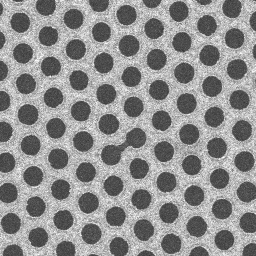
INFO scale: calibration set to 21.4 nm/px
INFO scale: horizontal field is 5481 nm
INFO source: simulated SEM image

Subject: a regular array of holes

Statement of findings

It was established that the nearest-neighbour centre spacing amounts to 650 nm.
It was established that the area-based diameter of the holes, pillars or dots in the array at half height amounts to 440 nm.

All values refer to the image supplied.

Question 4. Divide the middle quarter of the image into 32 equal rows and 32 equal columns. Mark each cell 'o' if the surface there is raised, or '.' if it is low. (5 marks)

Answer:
oooooooo....ooooooooo....ooo....
ooo.oooo....ooo....ooo..ooo.....
oo....oooooooo.....ooooooooo....
o.....oooooooo.....ooooooooo....
o.....ooooooooo....ooo...oooo..o
oo....ooo...oooo..ooo.....oooooo
ooo..ooo.....oooooooo.....oooooo
oooooooo.....oooooooo.....oooo..
oooooooo.....ooo...ooo...ooo....
ooo..oooo...ooo.....oooooooo....
oo....ooooooooo.....oooooooo....
oo.....oooooooo.....ooooooooo...
oo.....oooo.oooo...ooo....oooo.o
oo....ooo....ooooooooo.....ooooo
ooooooooo.....oooooooo.....ooooo
ooooooooo.....oooooooo.....ooo..
ooooooooo....oooo...oooo..ooo...
ooo....ooo..oooo....ooooooooo...
oo.....oooooooo......oooooooo...
oo.....oooooooo.....oooo..ooo...
ooo....ooo..........ooo....ooooo
ooo...oooo.....ooooooo......oooo
.oooooooo.....ooooooooo....ooooo
.oooooooo.....oooo.oooo....ooo..
.ooooooooo....ooo....ooo.oooo...
.ooo...ooooooooo.....oooooooo...
ooo.....oooooooo.....ooooooooo..
ooo.....ooooooooo....ooo...oooo.
ooo.....ooo...ooo...ooo.....oooo
.oooo.oooo.....oooooooo.....oooo
..oooooooo.....oooooooo.....oooo
..oooooooo.....ooo...ooo...ooo..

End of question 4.